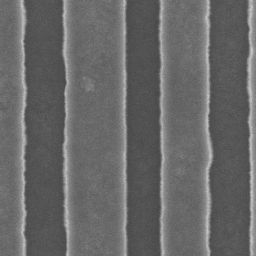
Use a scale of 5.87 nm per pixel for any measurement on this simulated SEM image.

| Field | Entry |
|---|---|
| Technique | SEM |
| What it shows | lines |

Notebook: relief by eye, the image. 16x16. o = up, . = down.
o...oooo..ooo...
o...oooo..ooo...
o...oooo..ooo...
o...oooo..ooo...
o...oooo..ooo...
oo..oooo..ooo...
oo..oooo..ooo...
o...oooo..ooo...
o...oooo..ooo...
o...oooo..ooo...
o...oooo..ooo...
o...oooo..ooo...
o...oooo..ooo...
oo..oooo..ooo...
o...oooo..ooo...
oo..oooo..ooo...